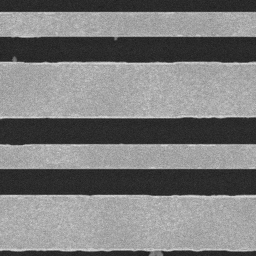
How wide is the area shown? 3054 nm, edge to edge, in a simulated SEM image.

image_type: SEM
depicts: lines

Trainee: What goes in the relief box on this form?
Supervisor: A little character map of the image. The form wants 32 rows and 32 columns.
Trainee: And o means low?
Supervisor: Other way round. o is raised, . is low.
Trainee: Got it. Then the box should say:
................................
................................
oooooooooooooooooooooooooooooooo
oooooooooooooooooooooooooooooooo
oooooooooooooooooooooooooooooooo
................................
................................
................................
oooooooooooooooooooooooooooooooo
oooooooooooooooooooooooooooooooo
oooooooooooooooooooooooooooooooo
oooooooooooooooooooooooooooooooo
oooooooooooooooooooooooooooooooo
oooooooooooooooooooooooooooooooo
oooooooooooooooooooooooooooooooo
................................
................................
................................
oooooooooooooooooooooooooooooooo
oooooooooooooooooooooooooooooooo
oooooooooooooooooooooooooooooooo
................................
................................
................................
ooooooooooooooooooo..oooo..ooooo
oooooooooooooooooooooooooooooooo
oooooooooooooooooooooooooooooooo
oooooooooooooooooooooooooooooooo
oooooooooooooooooooooooooooooooo
oooooooooooooooooooooooooooooooo
oooooooooooooooooooooooooooooooo
................................